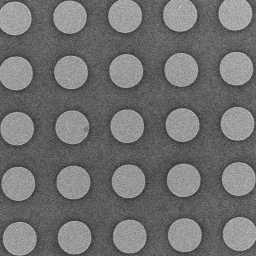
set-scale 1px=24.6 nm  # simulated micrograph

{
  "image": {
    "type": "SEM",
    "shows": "an array of small figures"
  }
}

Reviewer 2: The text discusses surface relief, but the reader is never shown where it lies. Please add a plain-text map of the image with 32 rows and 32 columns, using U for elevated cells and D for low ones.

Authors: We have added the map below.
DUUDDDDDUUDDDDUUUDDDDUUUDDDDUUUD
UUUUDDDUUUUDDDUUUUDDUUUUUDDUUUUD
UUUUDDDUUUUDDDUUUUDDDUUUUDDDUUUD
UUUDDDDUUUDDDDUUUDDDDUUUDDDDUUDD
DDDDDDDDDDDDDDDDDDDDDDDDDDDDDDDD
DDDDDDDDDDDDDDDDDDDDDDDDDDDDDDDD
DDDDDDDDDDDDDDDDDDDDDDDDDDDDDDDD
DUUDDDDDUUDDDDUUUDDDDUUUDDDDUUUD
UUUUDDDUUUUDDDUUUUDDDUUUUDDDUUUU
UUUUDDDUUUUDDDUUUUDDDUUUUDDDUUUD
UUUUDDDUUUDDDDDUUDDDDDUUDDDDDUDD
DDDDDDDDDDDDDDDDDDDDDDDDDDDDDDDD
DDDDDDDDDDDDDDDDDDDDDDDDDDDDDDDD
DDDDDDDDDDDDDDDDDDDDDDDDDDDDDUDD
DUUDDDDDUUUDDDUUUUDDDUUUUDDDUUUU
UUUUDDDUUUUDDDUUUUDDDUUUUDDDUUUU
UUUUDDDUUUUDDDUUUUDDDUUUUDDDUUUD
DUUUDDDDUUDDDDDUUDDDDDUUDDDDDDDD
DDDDDDDDDDDDDDDDDDDDDDDDDDDDDDDD
DDDDDDDDDDDDDDDDDDDDDDDDDDDDDDDD
DDDDDDDDDDDDDDDDDDDDDDDDDDDDDUUD
DUUUDDDDUUUDDDUUUUDDDUUUUDDDUUUU
UUUUDDDUUUUDDDUUUUDDDUUUUDDDUUUU
UUUUDDDUUUUDDDUUUUDDDUUUUDDDUUUU
DUUUDDDDUUDDDDDUUDDDDDUDDDDDDDDD
DDDDDDDDDDDDDDDDDDDDDDDDDDDDDDDD
DDDDDDDDDDDDDDDDDDDDDDDDDDDDDDDD
DDDDDDDDDDDDDDDDDDDDDDUUDDDDDUUD
DUUUDDDDUUUDDDUUUUDDDUUUUDDDUUUU
UUUUDDDUUUUDDDUUUUDDDUUUUDDDUUUU
UUUUDDDUUUUDDDUUUUDDDUUUUDDDUUUU
DUUUDDDDUUDDDDDDUDDDDDDDDDDDDDDD